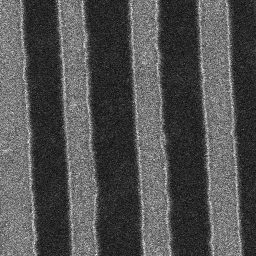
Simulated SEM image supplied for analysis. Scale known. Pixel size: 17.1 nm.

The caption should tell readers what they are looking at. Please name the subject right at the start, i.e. one or a few lines or trenches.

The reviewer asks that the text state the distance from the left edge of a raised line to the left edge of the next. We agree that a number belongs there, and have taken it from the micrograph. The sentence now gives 1170 nm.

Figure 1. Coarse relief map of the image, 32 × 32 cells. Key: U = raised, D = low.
DDDUUUUDDDUUUUUUDDDUUUUUUDDDUUUU
DDDUUUUUDDUUUUUUDDDDUUUUUDDDUUUU
DDDUUUUUDDUUUUUUUDDUUUUUUDDDUUUU
DDDUUUUUDDUUUUUUUDDDUUUUUDDDDUUU
DDDUUUUUDDDUUUUUUDDUUUUUUDDDDUUU
DDDUUUUUDDUUUUUUUDDDUUUUUDDDDUUU
DDDUUUUUDDDUUUUUUDDDUUUUUDDDDUUU
DDDUUUUUDDDUUUUUUDDDUUUUUDDDDUUU
DDDUUUUUDDDUUUUUUDDDUUUUUDDDDUUU
DDDUUUUUDDDUUUUUUDDDUUUUUDDDDUUU
DDDUUUUUDDDUUUUUUDDDUUUUUUDDDUUU
DDDUUUUUDDDUUUUUUDDDUUUUUDDDDUUU
DDDUUUUUDDDUUUUUUDDDUUUUUUDDDUUU
DDDUUUUUDDDUUUUUUDDDUUUUUUDDDUUU
DDDUUUUUDDDUUUUUUDDDUUUUUUDDDUUU
DDDUUUUUDDDUUUUUUDDDUUUUUUDDDUUU
DDDDUUUUDDDUUUUUUDDDUUUUUUDDDUUU
DDDDUUUUUDDUUUUUUDDDUUUUUUDDDUUU
DDDDUUUUDDDUUUUUUDDDUUUUUUDDDUUU
DDDDUUUUUDDUUUUUUDDDDUUUUUDDDUUU
DDDDUUUUUDDDUUUUUUDDDUUUUUDDDUUU
DDDDUUUUUDDDUUUUUUDDDUUUUUDDDUUU
DDDDUUUUUDDDUUUUUUDDDUUUUUDDDDUU
DDDDUUUUUDDDUUUUUUDDDUUUUUDDDDUU
DDDDUUUUUDDDUUUUUUDDDUUUUUDDDDUU
DDDDUUUUUDDDUUUUUUDDDUUUUUDDDDUU
DDDDUUUUUDDDUUUUUUDDDUUUUUDDDDUU
DDDDUUUUUDDDUUUUUUDDDUUUUUUDDDUU
DDDDUUUUUDDDUUUUUUDDDUUUUUUDDDUU
DDDDUUUUUDDDUUUUUUDDDUUUUUUDDDUU
DDDDUUUUUDDDUUUUUUDDDUUUUUUDDDUU
DDDDUUUUUDDDUUUUUUDDDUUUUUUDDDUU